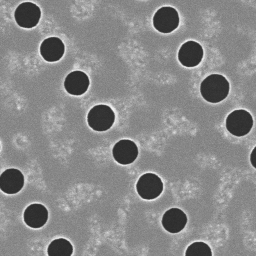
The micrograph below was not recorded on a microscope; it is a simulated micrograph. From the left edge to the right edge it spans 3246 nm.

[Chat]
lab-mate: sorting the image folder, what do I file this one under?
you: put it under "a regular array of holes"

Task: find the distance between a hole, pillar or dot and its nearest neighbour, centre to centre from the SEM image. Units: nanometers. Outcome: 532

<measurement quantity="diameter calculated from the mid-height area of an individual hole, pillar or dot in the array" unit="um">0.335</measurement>